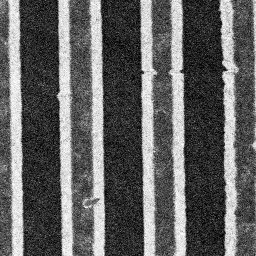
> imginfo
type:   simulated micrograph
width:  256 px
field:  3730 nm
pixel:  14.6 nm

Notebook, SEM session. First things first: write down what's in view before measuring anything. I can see one or a few lines or trenches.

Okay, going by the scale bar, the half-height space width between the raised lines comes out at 0.737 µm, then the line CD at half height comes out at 463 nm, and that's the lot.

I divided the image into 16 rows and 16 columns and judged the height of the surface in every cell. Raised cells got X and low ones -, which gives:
X---XX---XX---XX
X---XX---XX---XX
X---XX---XX---XX
X---XX---XX---XX
X---XX---XX---XX
X---XX---XX---XX
X---XX---XX---XX
X---XX---XX---XX
X---XX---XX---XX
X---XX---XX---XX
X---XX---XX---XX
X---XX---XX---XX
X---XX---XX---XX
X---XX---XX---XX
X---XX---XX---XX
X---XX---XX---XX